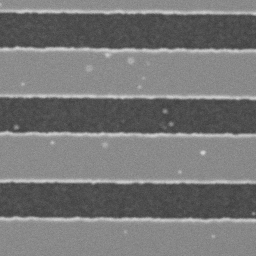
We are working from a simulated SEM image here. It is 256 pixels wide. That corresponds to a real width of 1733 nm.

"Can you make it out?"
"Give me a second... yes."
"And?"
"lines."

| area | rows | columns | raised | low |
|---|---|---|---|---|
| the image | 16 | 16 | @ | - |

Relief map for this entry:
@@@@@@@@@@@@@@@@
----------------
----------------
@@@@@@@@@@@@@@@@
@@@@@@@@@@@@@@@@
@@@@@@@@@@@@@@@@
----------------
----------------
@@@@@@@@@@@@@@@@
@@@@@@@@@@@@@@@@
@@@@@@@@@@@@@@@@
----------------
----------------
----------------
@@@@@@@@@@@@@@@@
@@@@@@@@@@@@@@@@